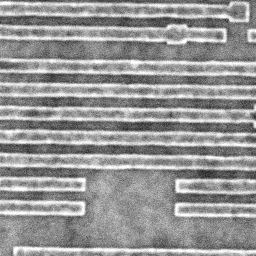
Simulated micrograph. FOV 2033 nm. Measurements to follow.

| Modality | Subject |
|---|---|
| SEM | wiring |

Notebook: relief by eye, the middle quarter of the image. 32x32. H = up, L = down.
HHHHHHHHHHHHHHHHHHHHHHHHHHHHHHHH
HHHHHHHHHHHHHHHHHHHHHHHHHHHHHHHH
LLLLLLLLLLLLLLLLLLLLLLLLLLLLHHHH
LLLLLLLLLLLLLLLLLLLLLLLLLLLLLLLL
LLLLLLLLLLLLLLLLLLLLLLLLLLLLLLLL
HHHHHHHHHHHHHHHHHHHHLLLLLLLLLLLL
HHHHHHHHHHHHHHHHHHHHHHHHHHHHHHHH
HHHHHHHHHHHHHHHHHHHHHHHHHHHHHHHH
LLLLLLLLLLLLLLLLLLLLLLLLLLLLLLLL
LLLLLLLLLLLLLLLLLLLLLLLLLLLLLLLL
LLLLLLLLLLLLLLLLLLLLLLLLLLLLLLLL
HHHHHHHHHHHHHHHHHHHHHHHHHHHHHHHH
HHHHHHHHHHHHHHHHHHHHHHHHHHHHHHHH
HHHHHHHHHHHHHHHHHHHHHHHHHHHHHHHH
LLLLLLLLLLLLLLLLLLLLLLLLLLLLLLLL
LLLLLLLLLLLLLLLLLLLLLLLLLLLLLLLL
LLLLLLLLLLLLLLLLLLLLLLLLLLLLLLLL
HHHHHHHHHHHHHHHHHHHHHHHHHHHHHHHH
HHHHHHHHHHHHHHHHHHHHHHHHHHHHHHHH
HHHHHHHHHHHHHHHHHHHHHHHHHHHHHHHH
LLLLLLLLLLLLLLLLLLLLLLLLLLLLLLLL
LLLLLLLLLLLLLLLLLLLLLLLLLLLLLLLL
LLLLLLLLLLLLLLLLLLLLLLLLLLLLLLLL
HHHHHHHHHHHHHHHHHHHHHHHHHHHHHHHH
HHHHHHHHHHHHHHHHHHHHHHHHHHHHHHHH
LHHHHHHHHHHHHHHHHHHHHHHHHHHHHHHH
LLLLLLLLLLLLLLLLLLLLLLLLLLLLLLLL
LLLLLLLLLLLLLLLLLLLLLLLLLLLLLLLL
LLLLLLLLLLLLLLLLLLLLLLLLLLLLLLLL
HHHHHLLLLLLLLLLLLLLLLLLLLLLLHHHH
HHHHHLLLLLLLLLLLLLLLLLLLLLLLHHHH
LLLLLLLLLLLLLLLLLLLLLLLLLLLLHHHH